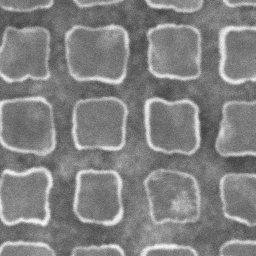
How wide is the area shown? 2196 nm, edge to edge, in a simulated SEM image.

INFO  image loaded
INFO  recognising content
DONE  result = raised bodies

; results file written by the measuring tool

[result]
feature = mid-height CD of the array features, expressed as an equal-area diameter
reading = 488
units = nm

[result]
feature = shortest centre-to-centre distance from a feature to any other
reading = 625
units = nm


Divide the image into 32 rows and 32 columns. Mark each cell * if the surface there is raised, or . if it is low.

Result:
******....***......******....***
................................
................................
.*.**....**..**....*****........
******..********...******...****
******..********...******...****
******..********...******...****
******..********...******...****
******...*******...******...****
******...******.....*****...****
................................
................................
.****......****....*............
******...*******..*******...****
*******..*******..*******...****
*******..*******..*******...****
*******..*******..*******..*****
*******..*******...******..*****
.******.....***....******..*****
................................
................................
....**....****..................
******....*****.............****
******....*****.............****
******....*****.............****
******...******.............****
******...******.............****
******....*****...............**
................................
................................
.****.......................****
*******..******...******....****